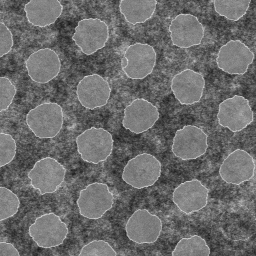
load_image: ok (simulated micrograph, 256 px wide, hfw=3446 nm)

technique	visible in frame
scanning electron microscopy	a regular array of raised bodies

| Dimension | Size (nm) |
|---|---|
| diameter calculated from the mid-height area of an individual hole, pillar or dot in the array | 462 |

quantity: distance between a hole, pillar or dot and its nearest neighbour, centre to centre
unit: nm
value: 731